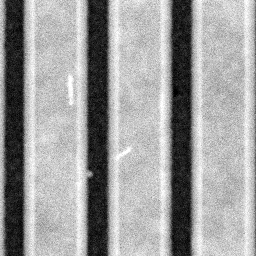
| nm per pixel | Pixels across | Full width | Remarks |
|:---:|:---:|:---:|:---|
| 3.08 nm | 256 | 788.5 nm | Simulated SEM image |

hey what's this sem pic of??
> one or a few lines or trenches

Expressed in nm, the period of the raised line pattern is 258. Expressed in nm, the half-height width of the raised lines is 165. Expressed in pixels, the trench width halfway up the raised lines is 30.4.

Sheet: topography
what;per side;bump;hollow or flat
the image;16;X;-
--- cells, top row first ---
--XXX--XXX--XXXX
--XXX--XXX--XXXX
--XXX--XXX--XXXX
--XXX--XXX--XXXX
--XXX--XXX--XXXX
--XXX--XXX--XXXX
--XXX--XXX--XXXX
--XXX--XXX--XXXX
--XXX--XXX--XXXX
--XXX--XXX--XXXX
--XXX--XXX--XXXX
--XXX--XXX--XXXX
--XXX--XXX--XXXX
--XXX--XXX--XXXX
--XXX--XXX--XXXX
--XXX--XXX--XXXX